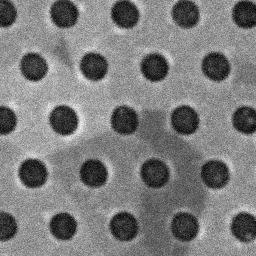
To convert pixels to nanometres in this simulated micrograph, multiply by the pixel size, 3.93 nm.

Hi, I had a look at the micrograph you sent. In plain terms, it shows a regular array of holes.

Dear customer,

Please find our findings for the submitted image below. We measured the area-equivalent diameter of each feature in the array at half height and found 120 nm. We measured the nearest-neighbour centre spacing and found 238 nm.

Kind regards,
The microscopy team